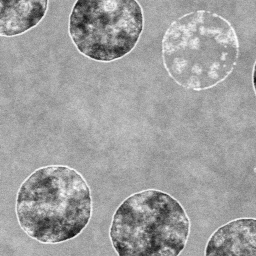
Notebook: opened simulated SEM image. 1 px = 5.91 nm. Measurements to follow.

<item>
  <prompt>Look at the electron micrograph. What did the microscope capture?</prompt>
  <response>holes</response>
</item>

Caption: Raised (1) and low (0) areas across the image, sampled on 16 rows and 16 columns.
0001100001111111
0011000001111111
1111100001111111
1111100011111111
1111111111111111
1111111111111111
1111111111111111
1111111111111111
1111111111111111
1111111111111111
1110111111111111
1000011111111111
1000001100011111
1000001000001111
1100011000001000
1111111000011000